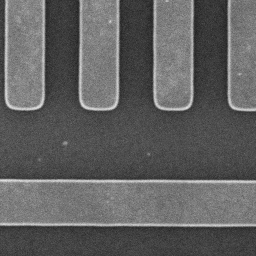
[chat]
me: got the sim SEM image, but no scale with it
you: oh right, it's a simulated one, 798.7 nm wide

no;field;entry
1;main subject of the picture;groups of lines, slits or small figures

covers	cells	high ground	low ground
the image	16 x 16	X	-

XXX--XX---XX--XX
XXX--XX---XX--XX
XXX--XX---XX--XX
XXX--XX---XX--XX
XXX--XX---XX--XX
XXX--XX---XX--XX
-X---XX---XX--XX
----------------
----------------
----------------
----------------
XXXXXXXXXXXXXXXX
XXXXXXXXXXXXXXXX
XXXXXXXXXXXXXXXX
----------------
----------------